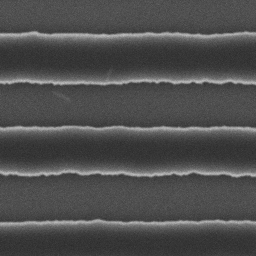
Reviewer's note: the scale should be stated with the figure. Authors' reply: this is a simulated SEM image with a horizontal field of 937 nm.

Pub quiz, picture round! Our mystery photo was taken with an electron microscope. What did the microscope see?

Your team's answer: lines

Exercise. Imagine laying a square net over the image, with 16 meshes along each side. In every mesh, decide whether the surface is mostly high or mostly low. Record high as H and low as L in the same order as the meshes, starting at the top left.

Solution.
LLLLLLLLLLLLLLLL
LLLLLLLLLLLLLLLL
HHHHHHHHHHHHHHHH
HHHHHHHHHHHHHHHH
HHHHHHHHHHHHHHHH
LLLLLLLLLLLLLLLL
LLLLLLLLLLLLLLLL
LLLLLLLLLLLLLLLL
HHHHHHHHHHHHHHHH
HHHHHHHHHHHHHHHH
HHHHHHHHHHHHHHHH
LLLLLLLLLLLLLLLL
LLLLLLLLLLLLLLLL
LLLLLLLLLLLLLLLL
HHHHHHHHHHHHHHHH
HHHHHHHHHHHHHHHH